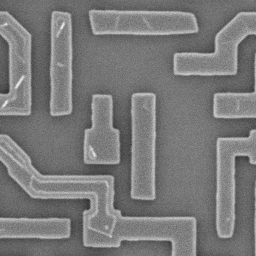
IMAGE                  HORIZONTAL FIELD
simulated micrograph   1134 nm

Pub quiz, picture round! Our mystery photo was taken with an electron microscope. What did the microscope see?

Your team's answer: wiring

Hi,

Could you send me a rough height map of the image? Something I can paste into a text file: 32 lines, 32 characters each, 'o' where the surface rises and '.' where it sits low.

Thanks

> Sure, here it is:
................................
...........oooooooo.............
oo.....oo..ooooooooooooo.....ooo
ooo....oo...ooooooooooooo...oooo
oooo...oo..................oooo.
.ooo...oo..................ooo..
.ooo..ooo..................ooo..
.ooo..ooo.............oooooooo..
.ooo..ooo.............oooooooo..
.ooo..ooo.......................
.ooo..ooo.......................
.ooo..ooo.......................
oooo..ooo...oo...oo........ooooo
oooo..ooo...oo...oo........ooooo
............oo...oo........ooooo
............oo...oo.............
...........oooo..oo............o
oo.........oooo..oo........ooooo
ooo........oooo..oo........ooooo
oooo.......oooo..oo........ooo.o
oooo.............oo........oo...
.oooo............oo........oo...
..oooooooooooo...oo........oo...
...ooooooooooo..ooo........oo...
....oooooooooo...oo........oo...
...........ooo.............oo...
...........oooo............oo...
oooooooo...ooooooooooooo...oo...
ooooooooo..ooooooooooooo...oo...
ooooooooo..ooooooooooooo....o...
...........oooo......ooo........
......................oo........